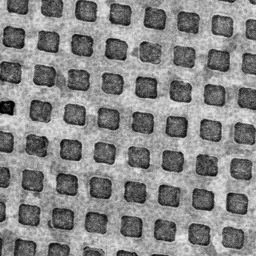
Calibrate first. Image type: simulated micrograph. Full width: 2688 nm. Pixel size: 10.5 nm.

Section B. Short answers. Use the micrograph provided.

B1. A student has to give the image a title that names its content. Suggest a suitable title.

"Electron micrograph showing a regular array of holes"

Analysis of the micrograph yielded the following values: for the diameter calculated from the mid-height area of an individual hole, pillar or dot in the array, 257 nanometres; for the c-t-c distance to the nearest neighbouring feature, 357 nm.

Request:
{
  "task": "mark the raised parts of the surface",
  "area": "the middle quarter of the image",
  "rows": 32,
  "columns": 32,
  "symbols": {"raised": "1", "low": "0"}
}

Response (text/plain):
11111111111111111111111111110000
10000111111111111111111111111111
10000011100000111111111111111111
10000001100000011100001111111111
10000001100000011100000111100001
10000011100000011100000111000000
11000011100000011100000111000000
11111111111000011100000111000000
11111111111111111110000111000000
11111111111111111111111111110000
00000111111111111111111111111111
00000011000001111111111111111111
00000011000000111000001111111111
00000011000000111000000111000011
00000111000000111000000110000001
11100111000000111000000110000001
11111111111101111000000110000001
11111111111111111110001111000001
11111111111111111111111111110011
00001111001111111111111111111111
00000110000001111011111111111111
00000110000001110000011110011111
00000110000001110000001100000011
00001110000001110000001100000011
11111111000001110000001100000011
11111111111111110000011100000011
11111111111111111111111110000011
00111111111111111111111111111111
00011110000111111111111111111111
00001100000011100001111111111111
00001100000011100000011100001111
00001100000011100000011100000111